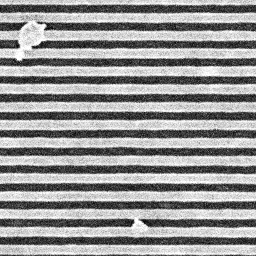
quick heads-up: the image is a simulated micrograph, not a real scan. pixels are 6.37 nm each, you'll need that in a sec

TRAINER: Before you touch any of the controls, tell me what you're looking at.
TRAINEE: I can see parallel lines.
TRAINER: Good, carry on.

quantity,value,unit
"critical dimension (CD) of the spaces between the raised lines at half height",8.87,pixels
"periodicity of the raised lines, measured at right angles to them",114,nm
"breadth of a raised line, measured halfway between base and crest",55.7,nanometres